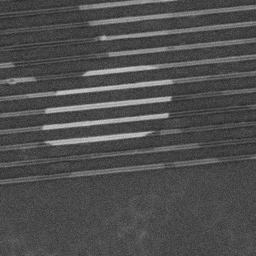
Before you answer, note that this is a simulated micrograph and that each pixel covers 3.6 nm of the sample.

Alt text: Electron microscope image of parallel lines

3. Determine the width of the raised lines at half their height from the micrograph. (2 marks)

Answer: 9.4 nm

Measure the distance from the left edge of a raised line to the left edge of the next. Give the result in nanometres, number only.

59.5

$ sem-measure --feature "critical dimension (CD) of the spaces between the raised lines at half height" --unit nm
50.2